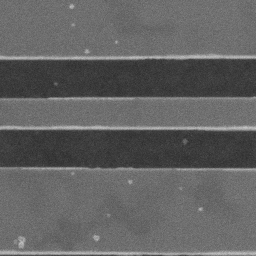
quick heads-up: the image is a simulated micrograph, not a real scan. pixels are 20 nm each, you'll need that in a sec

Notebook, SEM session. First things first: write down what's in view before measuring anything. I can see lines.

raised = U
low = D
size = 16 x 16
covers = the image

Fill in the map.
UUUUUUUUUUUUUUUU
UUUUUUUUUUUUUUUU
UUUUUUUUUUUUUUUU
UUUUUUUUUUUUUUUU
DDDDDDDDDDDDDDDD
DDDDDDDDDDDDDDDD
UUUUUUUUUUUUUUUU
UUUUUUUUUUUUUUUU
DDDDDDDDDDDDDDDD
DDDDDDDDDDDDDDDD
DDDDDDDDDDDDDDDD
UUUUUUUUUUUUUUUU
UUUUUUUUUUUUUUUU
UUUUUUUUUUUUUUUU
UUUUUUUUUUUUUUUU
UUUUUUUUUUUUUUUU